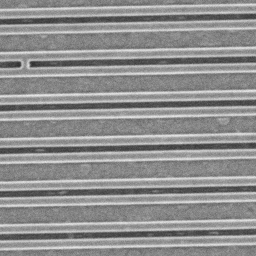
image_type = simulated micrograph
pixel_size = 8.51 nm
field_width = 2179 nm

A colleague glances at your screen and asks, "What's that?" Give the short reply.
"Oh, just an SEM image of parallel lines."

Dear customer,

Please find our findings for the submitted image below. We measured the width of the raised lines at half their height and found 75.5 nanometers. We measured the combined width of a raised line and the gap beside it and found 21 pixels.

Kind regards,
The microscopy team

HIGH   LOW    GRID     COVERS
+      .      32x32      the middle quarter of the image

.....................+++++++++++
++++++++++++++++++++++++++++++++
++++++++++++++++++++............
................................
................................
................................
................................
...+++++++++++++++++++++++++++++
++++++++++++++++++++++++++++++++
++++++++++++....................
................................
..+++++++.++++++++++++++++++++++
++++++++++++++++++++++++++++++++
+++++++++++.....................
................................
................................
................................
................................
++++++++++++++++++++++++++++++++
++++++++++++++++++++++++++++++++
++++............................
................................
++++++++++++++++++++++++++++++++
++++++++++++++++++++++++++++++++
++..............................
................................
................................
................................
................................
++++++++++++++++++++++++++++++++
++++++++++++++++++++++++++++++++
................................